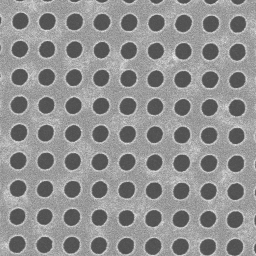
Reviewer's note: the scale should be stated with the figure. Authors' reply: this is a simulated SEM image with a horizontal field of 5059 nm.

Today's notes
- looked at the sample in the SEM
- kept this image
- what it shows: a regular array of holes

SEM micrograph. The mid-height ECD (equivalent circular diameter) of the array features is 333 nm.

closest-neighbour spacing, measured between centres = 535 nm